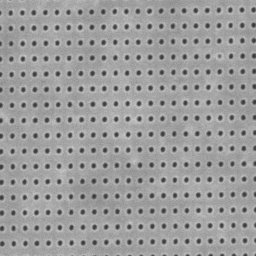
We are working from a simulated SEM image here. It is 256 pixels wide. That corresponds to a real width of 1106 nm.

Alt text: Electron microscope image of a regular array of holes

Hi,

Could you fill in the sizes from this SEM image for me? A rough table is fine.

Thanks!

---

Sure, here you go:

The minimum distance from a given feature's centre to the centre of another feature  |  11.4 px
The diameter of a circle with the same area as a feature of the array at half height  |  22.3 nanometres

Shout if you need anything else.